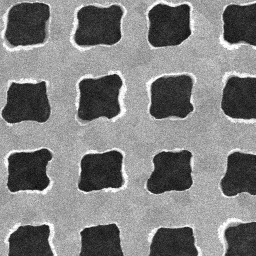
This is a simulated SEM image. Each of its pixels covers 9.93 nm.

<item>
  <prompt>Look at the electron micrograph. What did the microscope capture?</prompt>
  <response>a regular array of holes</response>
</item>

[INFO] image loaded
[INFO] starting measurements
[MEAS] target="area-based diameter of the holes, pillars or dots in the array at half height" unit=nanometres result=458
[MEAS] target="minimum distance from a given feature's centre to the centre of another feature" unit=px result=70.2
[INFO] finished